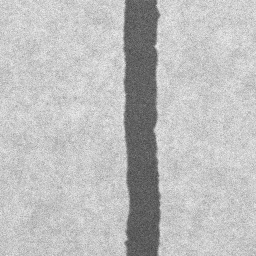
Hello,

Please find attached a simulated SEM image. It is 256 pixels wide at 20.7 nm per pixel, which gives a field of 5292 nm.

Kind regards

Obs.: one or a few lines or trenches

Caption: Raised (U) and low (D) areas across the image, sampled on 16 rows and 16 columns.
UUUUUUUUDDUUUUUU
UUUUUUUUDDUUUUUU
UUUUUUUUDDUUUUUU
UUUUUUUUDDUUUUUU
UUUUUUUUDDUUUUUU
UUUUUUUUDDUUUUUU
UUUUUUUUDDUUUUUU
UUUUUUUUDDUUUUUU
UUUUUUUUDDUUUUUU
UUUUUUUUDDUUUUUU
UUUUUUUUDDUUUUUU
UUUUUUUUDDUUUUUU
UUUUUUUUDDUUUUUU
UUUUUUUUDDUUUUUU
UUUUUUUUDDUUUUUU
UUUUUUUUDDUUUUUU